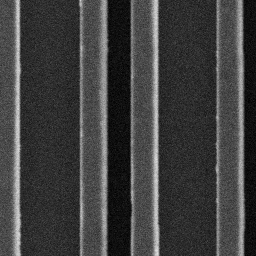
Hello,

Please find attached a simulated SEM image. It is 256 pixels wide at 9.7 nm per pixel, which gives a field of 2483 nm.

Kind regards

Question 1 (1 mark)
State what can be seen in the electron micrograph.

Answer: lines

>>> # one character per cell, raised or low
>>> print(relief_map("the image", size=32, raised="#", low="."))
##........###...####.......###..
##........###...####.......###..
##........###...####.......###..
##........###...####.......###..
##........###...####.......###..
##........###...####.......###..
##........###...####.......###..
##........###...####.......###..
##........###...####.......###..
##........###...####.......###..
##........###...####.......###..
##........###...####.......###..
##........###...####.......###..
##........###...####.......###..
##........###...####.......###..
##........###...####.......###..
##........###...####.......###..
##........###...####.......###..
##........###...####.......###..
##........###...####.......###..
##........###...####.......###..
##........###...####.......###..
##........###...####.......###..
##........###...####.......###..
##........###...####.......###..
##........###...####.......###..
##........###....###.......###..
##........###...####.......###..
##........###...####.......###..
##........###...####.......###..
##........###...####.......###..
##........###...####.......###..